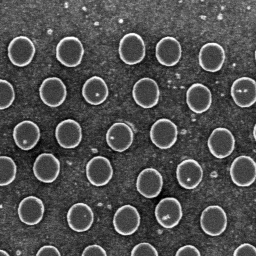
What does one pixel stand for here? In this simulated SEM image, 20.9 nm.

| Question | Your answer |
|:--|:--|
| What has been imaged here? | a regular array of raised bodies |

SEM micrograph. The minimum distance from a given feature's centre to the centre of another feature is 877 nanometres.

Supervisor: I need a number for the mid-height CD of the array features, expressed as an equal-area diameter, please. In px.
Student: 27